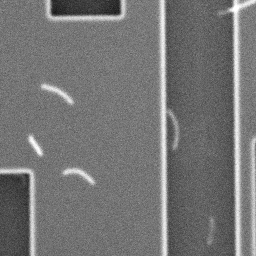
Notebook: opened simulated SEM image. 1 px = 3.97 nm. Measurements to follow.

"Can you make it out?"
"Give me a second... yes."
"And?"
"groups of lines, slits or small figures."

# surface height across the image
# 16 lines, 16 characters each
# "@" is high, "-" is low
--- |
@@@-----@@-----@
@@@@@@@@@@-----@
@@@@@@@@@@-----@
@@@@@@@@@@-----@
@@@@@@@@@@-----@
@@@@@@@@@@-----@
@@@@@@@@@@-----@
@@@@@@@@@@-----@
@@@@@@@@@@-----@
@@@@@@@@@@-----@
@@@@@@@@@@-----@
--@@@@@@@@-----@
--@@@@@@@@-----@
--@@@@@@@@-----@
--@@@@@@@@-----@
--@@@@@@@@-----@